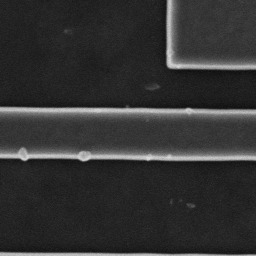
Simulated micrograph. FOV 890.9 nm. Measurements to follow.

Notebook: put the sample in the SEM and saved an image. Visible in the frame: groups of lines, slits or small figures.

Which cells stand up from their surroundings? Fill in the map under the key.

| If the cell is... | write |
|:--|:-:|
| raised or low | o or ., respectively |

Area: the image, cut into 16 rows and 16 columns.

...........ooooo
...........ooooo
...........ooooo
..........oooooo
................
................
................
oooooooooooooooo
oooooooooooooooo
oooooooooooooooo
................
................
................
................
................
................